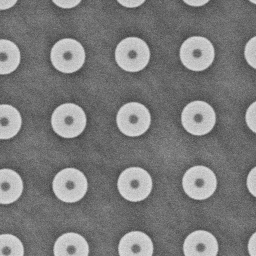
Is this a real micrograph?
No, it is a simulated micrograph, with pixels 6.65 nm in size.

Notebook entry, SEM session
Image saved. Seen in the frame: an array of small figures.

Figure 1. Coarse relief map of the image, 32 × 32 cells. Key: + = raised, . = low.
++.....+++.....+++......++......
................................
................................
................................
................................
++.....+++.....+++.....+++.....+
++....+++++...+++++....++++....+
++....+++++...+++++....++++....+
++.....+++.....+++......++......
................................
................................
................................
................................
++.....+++.....+++.....+++.....+
+++....++++....++++....++++....+
+++...+++++....++++....++++....+
++.....+++.....+++......++......
................................
................................
................................
................................
++......++.....+++.....++++....+
+++....++++....++++....++++....+
+++....++++....++++....++++....+
++.....+++.....+++......++......
................................
................................
................................
................................
++......++......++......+++.....
+++....++++....++++....++++....+
+++....++++....++++....++++....+